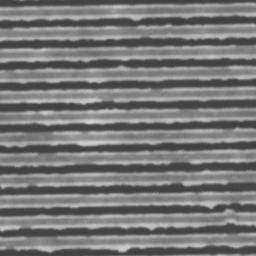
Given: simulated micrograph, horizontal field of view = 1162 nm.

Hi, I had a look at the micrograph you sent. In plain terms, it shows parallel lines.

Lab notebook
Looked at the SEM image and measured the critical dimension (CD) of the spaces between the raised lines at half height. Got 36.3 nm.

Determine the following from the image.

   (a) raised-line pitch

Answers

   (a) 95.1 nm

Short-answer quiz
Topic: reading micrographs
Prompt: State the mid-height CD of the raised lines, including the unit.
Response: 0.0591 µm